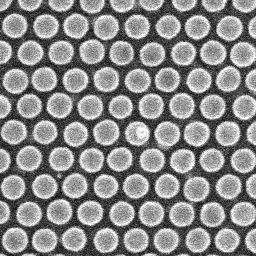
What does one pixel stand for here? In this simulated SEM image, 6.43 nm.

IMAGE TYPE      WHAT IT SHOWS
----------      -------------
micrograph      a regular array of raised bodies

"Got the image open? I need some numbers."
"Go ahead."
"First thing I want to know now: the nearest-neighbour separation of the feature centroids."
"190 nanometres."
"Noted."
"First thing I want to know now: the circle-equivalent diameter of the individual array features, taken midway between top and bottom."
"152 nanometers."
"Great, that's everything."